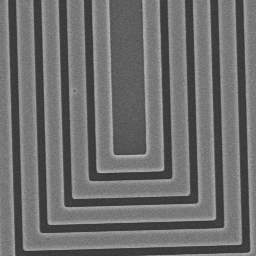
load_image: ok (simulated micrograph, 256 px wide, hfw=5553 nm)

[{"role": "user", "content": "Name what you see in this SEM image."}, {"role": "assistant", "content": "groups of lines, slits or small figures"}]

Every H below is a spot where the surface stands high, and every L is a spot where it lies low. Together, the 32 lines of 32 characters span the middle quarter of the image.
LHHHHLLHHHHHLLLLLLLLHHHHLLHHHHHL
LHHHHLLHHHHHLLLLLLLLHHHHLLHHHHHL
LHHHHLLLHHHHLLLLLLLLHHHHLLHHHHHL
LHHHHLLLHHHHLLLLLLLLHHHHLLHHHHHL
LHHHHLLLHHHHLLLLLLLLHHHHLLHHHHHL
LHHHHLLLHHHHLLLLLLLLHHHHLLHHHHHL
LHHHHLLLHHHHLLLLLLLLHHHHLLLHHHHL
LHHHHLLLHHHHLLLLLLLLHHHHLLLHHHHL
LHHHHLLLHHHHLLLLLLLLHHHHHLLHHHHL
LLHHHLLLHHHHLLLLLLLLHHHHHLLHHHHL
LLHHHLLLHHHHLLLLLLLLHHHHHLLHHHHL
LLHHHLLLHHHHLLLLLLLLHHHHHLLHHHHL
LLHHHHLLHHHHLLLLLLLLHHHHHLLHHHHL
LLHHHHLLHHHHLLLLLLLLLHHHHLLHHHHL
LLHHHHLLHHHHLLLLLLLLLHHHHLLHHHHL
LLHHHHLLHHHHLLLLLLLLLHHHHLLHHHHL
LLHHHHLLHHHHLLLLLLLLLHHHHLLHHHHL
LLHHHHLLHHHHLLLLLLLLLHHHHLLHHHHL
LLHHHHLLHHHHLLLLLLLLLHHHHLLHHHHL
LLHHHHLLHHHHLLLLLLLLLHHHHLLHHHHL
LLHHHHLLHHHHLLLLLLLLLHHHHLLHHHHL
LLHHHHLLHHHHLLLLLLLLLHHHHLLHHHHL
LLHHHHLLHHHHLLLLLLLLHHHHHLLHHHHL
LLHHHHLLHHHHHHHHHHHHHHHHHLLHHHHL
LLHHHHLLHHHHHHHHHHHHHHHHHLLHHHHL
LLHHHHLLHHHHHHHHHHHHHHHHHLLHHHHL
LLHHHHLLHHHHHHHHHHHHHHHHHLLHHHHL
LLHHHHLLLLLLLLLLLLLLLLLLLLLHHHHL
LLHHHHLLLLLLLLLLLLLLLLLLLLLHHHHL
LLHHHHHHHHHHHHHHHHHHHHHHHHHHHHHL
LLHHHHHHHHHHHHHHHHHHHHHHHHHHHHHL
LLHHHHHHHHHHHHHHHHHHHHHHHHHHHHHL